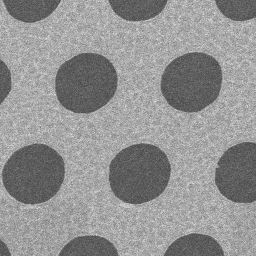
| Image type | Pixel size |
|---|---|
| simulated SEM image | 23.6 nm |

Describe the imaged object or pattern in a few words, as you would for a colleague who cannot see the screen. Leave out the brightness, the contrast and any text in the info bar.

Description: holes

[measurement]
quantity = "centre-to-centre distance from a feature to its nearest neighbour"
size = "2480 nanometres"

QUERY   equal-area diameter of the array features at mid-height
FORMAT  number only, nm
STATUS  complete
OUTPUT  1460